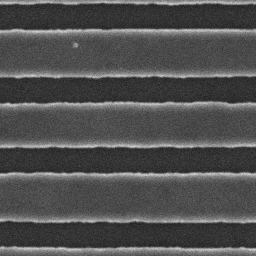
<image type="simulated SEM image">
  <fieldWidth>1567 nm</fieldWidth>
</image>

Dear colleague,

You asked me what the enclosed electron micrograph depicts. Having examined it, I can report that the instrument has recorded lines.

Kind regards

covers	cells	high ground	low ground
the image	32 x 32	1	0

00000000000000000000010000000000
00000000000000000000000000000000
00000000000000000000000000000000
00000000000000000000000000000000
11111111111111111111111111111111
11111111111111111111111111111111
11111111111111111111111111111111
11111111111111111111111111111111
11111111111111111111111111111111
11111111111111111111111111111001
00000000000000000000000000000000
00000000000000000000000000000000
00000000000000000000000000000000
11111111111111111111111111111111
11111111111111111111111111111111
11111111111111111111111111111111
11111111111111111111111111111111
11111111111111111111111111111111
00000000000000000000000000000000
00000000000000000000000000000000
00000000000000000000000000000000
00000000000000000000000000000000
11111111111111111111111111111111
11111111111111111111111111111111
11111111111111111111111111111111
11111111111111111111111111111111
11111111111111111111111111111111
11111111111111111111111111111111
00000000000000000000000000000000
00000000000000000000000000000000
00000000000000000000000000000000
11111111111111111111111111111111